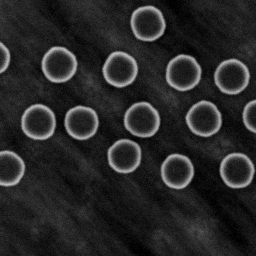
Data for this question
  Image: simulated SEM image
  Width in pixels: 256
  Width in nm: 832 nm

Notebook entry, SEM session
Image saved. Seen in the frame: a regular array of raised bodies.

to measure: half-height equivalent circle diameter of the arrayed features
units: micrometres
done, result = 0.111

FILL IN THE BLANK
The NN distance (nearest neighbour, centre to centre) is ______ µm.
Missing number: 0.161